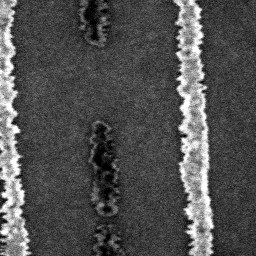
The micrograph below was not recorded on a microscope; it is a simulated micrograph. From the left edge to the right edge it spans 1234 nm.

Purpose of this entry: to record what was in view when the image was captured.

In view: one or a few lines or trenches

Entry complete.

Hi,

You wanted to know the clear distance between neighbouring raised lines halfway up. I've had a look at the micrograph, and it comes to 74.1 px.